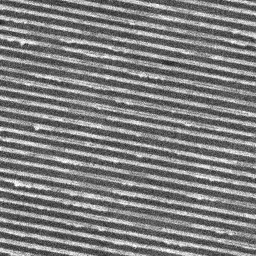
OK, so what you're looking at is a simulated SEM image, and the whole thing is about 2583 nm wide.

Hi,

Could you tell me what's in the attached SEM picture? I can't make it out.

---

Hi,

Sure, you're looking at parallel lines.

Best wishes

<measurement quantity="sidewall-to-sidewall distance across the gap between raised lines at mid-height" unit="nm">67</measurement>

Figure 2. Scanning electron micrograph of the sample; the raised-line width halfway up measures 28.5 nm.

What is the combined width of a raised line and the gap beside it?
100 nanometres